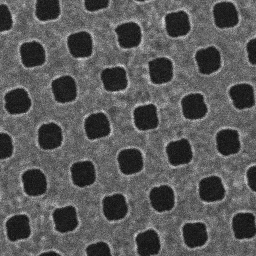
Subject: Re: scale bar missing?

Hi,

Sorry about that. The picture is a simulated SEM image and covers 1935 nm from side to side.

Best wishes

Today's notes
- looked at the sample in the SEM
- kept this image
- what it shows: a regular array of holes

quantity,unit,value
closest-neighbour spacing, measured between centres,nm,360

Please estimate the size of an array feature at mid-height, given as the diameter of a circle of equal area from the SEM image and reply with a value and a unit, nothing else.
211 nm